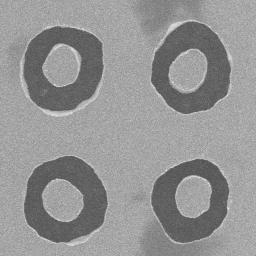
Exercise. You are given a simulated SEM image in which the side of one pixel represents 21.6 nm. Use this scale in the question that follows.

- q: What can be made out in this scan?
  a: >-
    ring-shaped grooves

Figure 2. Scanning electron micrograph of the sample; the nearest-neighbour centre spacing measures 2.73 micrometres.